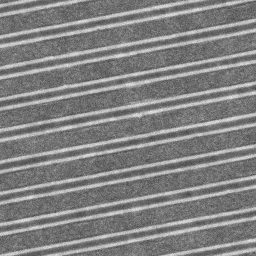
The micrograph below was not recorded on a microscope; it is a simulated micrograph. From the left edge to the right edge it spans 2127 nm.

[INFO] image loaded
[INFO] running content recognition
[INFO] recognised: parallel lines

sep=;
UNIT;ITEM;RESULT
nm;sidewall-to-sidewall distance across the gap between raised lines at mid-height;173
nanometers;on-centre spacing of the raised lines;256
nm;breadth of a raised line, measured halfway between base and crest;82.7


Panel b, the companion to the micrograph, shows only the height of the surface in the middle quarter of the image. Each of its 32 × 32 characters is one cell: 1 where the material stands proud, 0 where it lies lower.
00000000000000000000000000000111
00000000000000000000000111111111
00000000000000000011111111111110
00000000000011111111111110000000
00000001111111111111000000000000
00111111111111100000000000000000
11111111100000000000000000000000
11110000000000000000000000000000
00000000000000000000000000001111
00000000000000000000001111111111
00000000000000000111111111111100
00000000000011111111111100000000
00000011111111111111000000000000
01111111111111000000000000000000
11111111000000000000000000000000
11100000000000000000000000000000
00000000000000000000000000011111
00000000000000000000001111111111
00000000000000001111111111111100
00000000000111111111111110000000
00000111111111111110000000000000
11111111111111000000000000000000
11111111100000000000000000000000
11100000000000000000000000000001
00000000000000000000000000111111
00000000000000000000111111111111
00000000000000011111111111111000
00000000001111111111111100000000
00001111111111111100000000000000
11111111111110000000000000000000
11111111000000000000000000000000
11000000000000000000000000000011